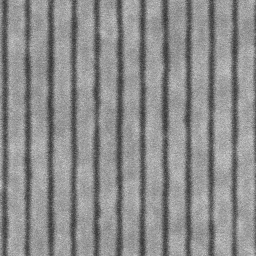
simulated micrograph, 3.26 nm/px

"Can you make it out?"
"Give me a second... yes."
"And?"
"parallel lines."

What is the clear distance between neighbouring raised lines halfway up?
6.87 pixels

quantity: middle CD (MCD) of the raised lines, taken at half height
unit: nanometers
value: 51.4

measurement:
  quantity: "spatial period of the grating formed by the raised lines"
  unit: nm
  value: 74.9